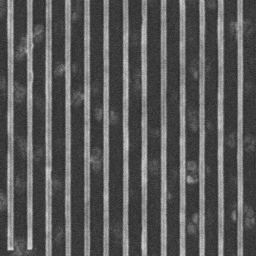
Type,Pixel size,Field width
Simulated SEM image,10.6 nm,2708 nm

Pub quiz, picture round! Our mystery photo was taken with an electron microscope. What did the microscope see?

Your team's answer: parallel lines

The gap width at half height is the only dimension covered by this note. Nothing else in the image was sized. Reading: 148 nm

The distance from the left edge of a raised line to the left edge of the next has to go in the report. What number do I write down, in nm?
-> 202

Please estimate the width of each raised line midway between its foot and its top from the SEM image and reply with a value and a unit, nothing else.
48.9 nanometers